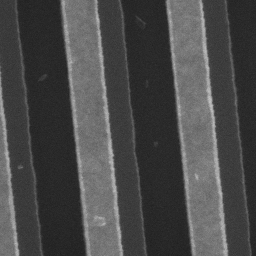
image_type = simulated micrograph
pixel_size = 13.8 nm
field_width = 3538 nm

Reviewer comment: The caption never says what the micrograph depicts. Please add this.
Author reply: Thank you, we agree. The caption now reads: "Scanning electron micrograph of lines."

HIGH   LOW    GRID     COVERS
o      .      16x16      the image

o...oooo..oooo..
o...oooo...ooo..
o...oooo...ooo..
o...oooo...ooo..
o...oooo...oooo.
oo..oooo...oooo.
oo..oooo...oooo.
oo...ooo...oooo.
oo...ooo...oooo.
oo...ooo...oooo.
oo...oooo..oooo.
oo...oooo...ooo.
oo...oooo...ooo.
oo...oooo...oooo
oo...oooo...oooo
ooo..oooo...oooo